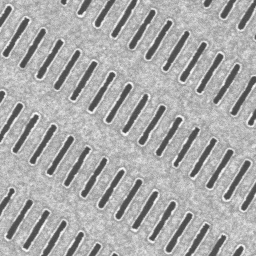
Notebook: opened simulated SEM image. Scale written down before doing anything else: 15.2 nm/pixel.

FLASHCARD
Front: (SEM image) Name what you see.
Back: a regular array of holes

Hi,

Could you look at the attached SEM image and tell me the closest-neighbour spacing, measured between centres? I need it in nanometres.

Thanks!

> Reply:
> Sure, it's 304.